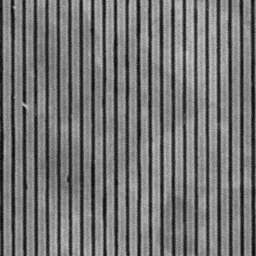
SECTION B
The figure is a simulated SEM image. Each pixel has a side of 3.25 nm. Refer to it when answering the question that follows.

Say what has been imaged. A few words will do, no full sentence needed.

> parallel lines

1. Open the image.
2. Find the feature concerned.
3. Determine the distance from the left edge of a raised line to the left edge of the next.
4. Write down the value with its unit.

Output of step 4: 37.1 nanometres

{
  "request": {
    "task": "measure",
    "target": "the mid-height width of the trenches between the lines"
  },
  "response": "14.2 nanometres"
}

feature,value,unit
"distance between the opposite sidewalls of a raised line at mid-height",23.1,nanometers